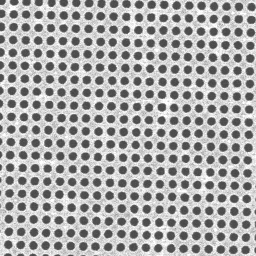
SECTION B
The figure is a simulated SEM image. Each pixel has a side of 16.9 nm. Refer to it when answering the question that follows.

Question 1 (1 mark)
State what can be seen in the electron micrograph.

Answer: a regular array of holes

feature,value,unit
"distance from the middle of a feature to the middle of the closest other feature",208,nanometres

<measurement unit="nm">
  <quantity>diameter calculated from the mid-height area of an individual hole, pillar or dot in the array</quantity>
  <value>150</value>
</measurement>